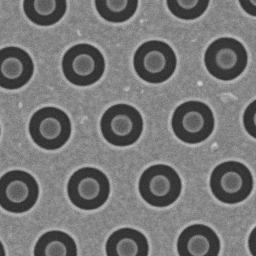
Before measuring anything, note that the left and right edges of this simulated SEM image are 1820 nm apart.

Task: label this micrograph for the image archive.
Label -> an array of small figures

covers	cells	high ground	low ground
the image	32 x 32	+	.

+++.....++++.....++++.....++++..
+++.....++++.....++++.....+++++.
++++....+++++...+++++++.++++++++
++++++++++++++++++++++++++++++++
++++++++++++++++++++++++++++++++
+++++++++..+++++++...+++++....++
...+++++.....++++.....++++.....+
....++++.....++++.....+++......+
....++++.....++++.....++++.....+
....++++.....++++.....++++....++
...++++++...+++++++.++++++++++++
++++++++++++++++++++++++++++++++
++++++++++++++++++++++++++++++++
+++++..++++++....+++++....+++++.
++++.....++++.....+++......+++..
+++......+++......+++......+++..
++++.....++++.....++++.....++++.
++++.....++++....+++++....++++++
+++++...++++++++++++++++++++++++
++++++++++++++++++++++++++++++++
++++++++++++++++++++.++++++....+
+...+++++....+++++....++++.....+
.....++++.....+++......+++......
.....+++......+++......+++......
.....+++......++++....+++++....+
....+++++....+++++....++++++..++
+..+++++++++++++++++++++++++++++
++++++++++++++++++++++++++++++++
+++++++++++++++..++++++...++++++
+++++....+++++....++++.....++++.
++++......+++......+++......+++.
.+++......+++......+++......+++.